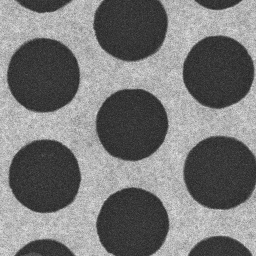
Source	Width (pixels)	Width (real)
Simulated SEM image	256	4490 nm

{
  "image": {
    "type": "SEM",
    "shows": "holes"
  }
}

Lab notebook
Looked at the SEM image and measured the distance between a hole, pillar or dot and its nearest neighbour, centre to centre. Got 1.77 microns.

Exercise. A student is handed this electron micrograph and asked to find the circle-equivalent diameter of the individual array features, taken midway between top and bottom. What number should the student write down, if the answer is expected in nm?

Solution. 1270